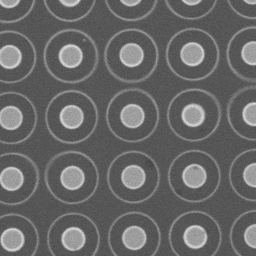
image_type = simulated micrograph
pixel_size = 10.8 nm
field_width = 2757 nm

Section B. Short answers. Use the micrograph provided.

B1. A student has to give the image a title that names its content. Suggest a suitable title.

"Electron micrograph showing an array of small figures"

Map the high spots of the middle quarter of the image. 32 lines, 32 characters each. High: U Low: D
DUUDDDDDUUUDDDDDDDDDDDDUUUDDDDDD
DDDDDDDUUUUUDDDDDDDDDDUUUUUDDDDD
DDDDDDUUUUUUDDDDDDDDDUUUUUUUDDDD
DDDDDUUUUUUUUUDDDDDDUUUUUUUUUUDD
DDUUUUUUUUUUUUUUUUUUUUUUUUUUUUUU
UUUUUUUUUUUUUUUUUUUUUUUUUUUUUUUU
UUUUUUUUUUUUUUUUDDDUUUUUUUUUUUUD
DDDDDUUUUUUUUUDDDDDDDUUUUUUUUDDD
DDDDDDUUUUUUDDDDDDDDDDUUUUUUDDDD
DDDDDDDUUUUUDDDDDDDDDDUUUUUDDDDD
DDDDDDDDUUUDDDDDUUDDDDDUUUDDDDDD
UUUUDDDDUUUDDDDUUUUDDDDUUUDDDDUU
UUUUUDDDUUUDDDUUUUUUDDDDUUDDDDUU
UUUUUDDDUUUDDDUUUUUUDDDDUUDDDDUU
UUUUUDDDUUUDDDDUUUUUDDDUUUDDDDUU
DUUUDDDDUUUDDDDDUUUDDDDUUUUDDDDD
DDDDDDDUUUUUDDDDDDDDDDUUUUUDDDDD
DDDDDDUUUUUUUDDDDDDDDUUUUUUUDDDD
DDDDDUUUUUUUUUDDDDDDUUUUUUUUUUDD
DDDUUUUUUUUUUUUUUUUUUUUUUUUUUUUU
UUUUUUUUUUUUUUUUUUUUUUUUUUUUUUUU
UUUUUUUUUUUUUUUUUUUUUUUUUUUUUUUU
DDDDUUUUUUUUUUUDDDDDUUUUUUUUUUDD
DDDDDDUUUUUUUDDDDDDDDUUUUUUUDDDD
DDDDDDDUUUUUDDDDDDDDDDUUUUUDDDDD
DDDDDDDDUUUUDDDDDDDDDDDUUUUDDDDD
UUUUDDDDUUUDDDDUUUUUDDDUUUDDDDUU
UUUUUDDDUUUDDDDUUUUUDDDDUUDDDDUU
UUUUUDDDUUUDDDDUUUUUDDDDUUDDDDUU
UUUUUDDDUUUDDDDUUUUUDDDDUUDDDDUU
UUUUDDDDUUUDDDDDUUUDDDDUUUUDDDDU
DDDDDDDUUUUUDDDDDDDDDDDUUUUDDDDD